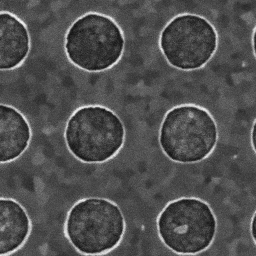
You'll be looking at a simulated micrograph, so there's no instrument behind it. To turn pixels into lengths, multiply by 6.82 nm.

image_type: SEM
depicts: holes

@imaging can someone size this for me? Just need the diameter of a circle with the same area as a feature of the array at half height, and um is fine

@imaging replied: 0.385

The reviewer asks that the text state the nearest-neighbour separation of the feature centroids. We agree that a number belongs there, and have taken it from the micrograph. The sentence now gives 627 nm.